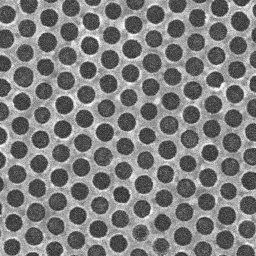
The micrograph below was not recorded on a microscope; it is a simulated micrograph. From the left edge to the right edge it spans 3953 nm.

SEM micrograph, a regular array of holes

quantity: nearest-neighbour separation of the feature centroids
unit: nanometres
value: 372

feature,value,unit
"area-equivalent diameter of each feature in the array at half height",289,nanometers